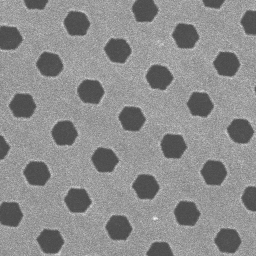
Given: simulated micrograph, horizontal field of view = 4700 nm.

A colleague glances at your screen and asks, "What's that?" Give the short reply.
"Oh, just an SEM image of a regular array of holes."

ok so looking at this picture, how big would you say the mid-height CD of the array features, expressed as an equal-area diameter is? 481 nm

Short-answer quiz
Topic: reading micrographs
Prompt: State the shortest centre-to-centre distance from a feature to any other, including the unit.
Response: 897 nm